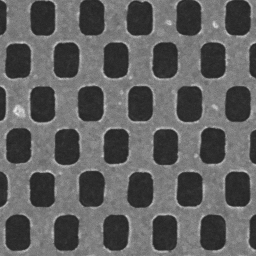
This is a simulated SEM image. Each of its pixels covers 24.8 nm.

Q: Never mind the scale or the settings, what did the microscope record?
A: a regular array of holes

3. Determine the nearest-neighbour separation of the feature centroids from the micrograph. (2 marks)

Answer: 1200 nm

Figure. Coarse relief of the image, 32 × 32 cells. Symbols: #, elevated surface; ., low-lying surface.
.###...###...###...###...###...#
.###...###...###...###...###...#
.###...###...###...###...###...#
.###...###...###...###...###...#
#####.#####.#####.#####.#####.##
#..####..####...####..####..####
#...###...###...###...###...###.
#...###...###...###...###...###.
#...###...###...###...###...###.
#..####..####...###...###...####
################################
.###...###...###...###...###...#
.###...###...###...###...###...#
.###...###...###...###...###...#
.###...###...###...###...###...#
################################
#...###...###...####..###...####
#...###...###...###...###...###.
#...###...###...###...###...###.
#...###...###...###...###...###.
##.####..#####.#####..####.#####
###########.#################..#
.###...###...###...###...###...#
.###...###...###...###...###...#
.###...###...###...###...###...#
.###...###...###...###...####..#
################################
#...###...###...###...###...###.
#...###...###...###...###...###.
#...###...###...###...###...###.
#...###...###...###...###...###.
################################